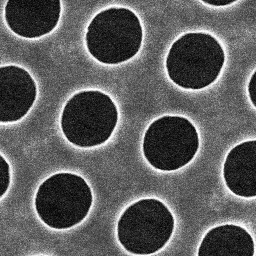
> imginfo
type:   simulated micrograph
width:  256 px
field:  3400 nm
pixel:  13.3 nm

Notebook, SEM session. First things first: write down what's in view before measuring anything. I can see holes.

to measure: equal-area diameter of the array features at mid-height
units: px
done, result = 56.5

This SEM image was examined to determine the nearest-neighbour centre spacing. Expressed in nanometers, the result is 1130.